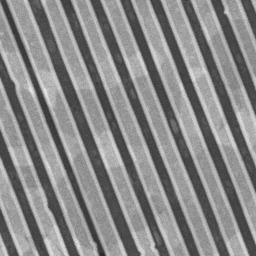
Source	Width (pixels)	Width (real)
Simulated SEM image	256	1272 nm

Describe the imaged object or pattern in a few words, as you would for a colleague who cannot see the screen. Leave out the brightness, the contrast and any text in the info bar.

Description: parallel lines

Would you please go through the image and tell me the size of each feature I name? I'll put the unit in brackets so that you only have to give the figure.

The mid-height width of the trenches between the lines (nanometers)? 66.5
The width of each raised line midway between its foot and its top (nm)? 75.8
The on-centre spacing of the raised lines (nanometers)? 140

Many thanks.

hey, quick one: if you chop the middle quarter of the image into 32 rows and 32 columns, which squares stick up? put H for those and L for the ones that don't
LHHHHLLLHHHHLLLLHHHHLLLLHHHLLLLH
LHHHHLLLLHHHHLLLHHHHLLLLHHHHLLLH
LLHHHHLLLHHHHLLLLHHHHLLLHHHHLLLL
LLHHHHLLLLHHHHLLLHHHHLLLLHHHHLLL
LLHHHHHLLLHHHHLLLLHHHLLLLHHHHLLL
LLLHHHHLLLHHHHLLLLHHHHLLLLHHHLLL
LLLHHHHLLLLHHHHLLLHHHHLLLLHHHHLL
LLLLHHHHLLLHHHHLLLLHHHHLLLHHHHLL
LLLLHHHHLLLHHHHHLLLHHHHLLLLHHHLL
LLLLHHHHLLLLHHHHLLLHHHHLLLLHHHHL
HLLLLHHHHLLLHHHHLLLLHHHHLLLHHHHL
HLLLLHHHHLLLLHHHHLLLHHHHLLLLHHHH
HLLLLLHHHHLLLHHHHLLLLHHHHLLLHHHH
HHLLLLHHHHLLLHHHHHLLLHHHHLLLLHHH
HHLLLLHHHHLLLLHHHHLLLHHHHLLLLHHH
HHHLLLLHHHHLLLHHHHLLLLHHHHLLLHHH
HHHLLLLHHHHLLLLHHHHLLLHHHHLLLLHH
HHHLLLLLHHHHLLLHHHHLLLHHHHHLLLHH
HHHHLLLLHHHHLLLHHHHLLLLHHHHLLLLH
HHHHLLLLHHHHLLLLHHHHLLLHHHHLLLLH
HHHHHLLLLHHHHLLLHHHHLLLLHHHHLLLH
LHHHHLLLLHHHHLLLLHHHHLLLHHHHLLLL
LHHHHLLLLHHHHHLLLHHHHLLLLHHHLLLL
LHHHHHLLLLHHHHLLLHHHHLLLLHHHHLLL
LLHHHHLLLLHHHHLLLLHHHHLLLHHHHLLL
LLHHHHHLLLLHHHHLLLHHHHLLLLHHHHLL
LLLHHHHLLLLHHHHLLLLHHHHLLLHHHHLL
LLLHHHHLLLLHHHHLLLLHHHHLLLLHHHLL
HLLHHHHHLLLLHHHHLLLHHHHLLLLHHHHL
HLLLHHHHLLLLHHHHLLLLHHHHLLLHHHHL
HLLLHHHHLLLLLHHHHLLLHHHHLLLLHHHH
HHLLHHHHHLLLLHHHHLLLHHHHHLLLHHHH